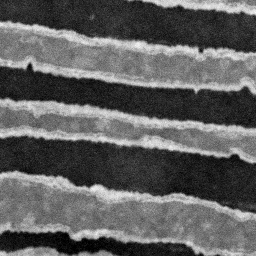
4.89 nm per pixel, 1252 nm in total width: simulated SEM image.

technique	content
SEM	one or a few lines or trenches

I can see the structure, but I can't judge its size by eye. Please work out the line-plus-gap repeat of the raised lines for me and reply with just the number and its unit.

76.4 pixels